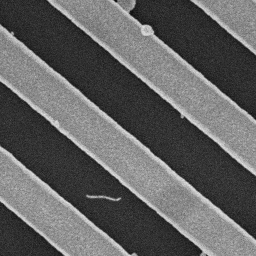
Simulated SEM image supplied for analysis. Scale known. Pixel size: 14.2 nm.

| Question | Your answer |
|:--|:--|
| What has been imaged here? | lines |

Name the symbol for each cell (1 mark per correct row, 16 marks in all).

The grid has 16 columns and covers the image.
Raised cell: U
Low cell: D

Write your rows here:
DDDDUUUUDDDDDUUU
DDDDDUUUUDDDDDUU
UDDDDDUUUUDDDDDU
UUDDDDDUUUUDDDDD
UUUUDDDDUUUUDDDD
DUUUUDDDDUUUUUDD
DDUUUUDDDDDUUUUD
DDDUUUUDDDDDUUUU
DDDDUUUUDDDDDUUU
DDDDDUUUUDDDDDUU
UUDDDDDUUUUDDDDU
UUUDDDDDUUUUDDDD
UUUUDDDDDUUUUDDD
DUUUUDDDDDUUUUDD
DDUUUUDDDDDUUUUD
DDDUUUUUDDDDUUUU